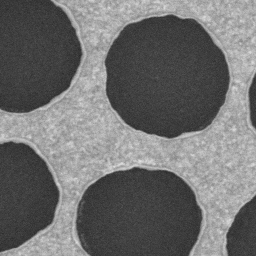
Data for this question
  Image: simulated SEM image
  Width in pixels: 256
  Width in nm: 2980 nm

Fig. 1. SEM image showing holes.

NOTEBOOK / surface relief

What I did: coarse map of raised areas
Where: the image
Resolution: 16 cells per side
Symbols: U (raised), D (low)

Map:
DDDDUUUUUUUUUUUU
DDDDDUUUDDDDDUUU
DDDDDUUDDDDDDUUU
DDDDDUUDDDDDDDUU
DDDDDUUDDDDDDDUU
DDDDUUUDDDDDDDUU
DDDUUUUDDDDDDDUD
UUUUUUUUDDDDDUUU
UUUUUUUUUUDUUUUU
DDUUUUUUUUUUUUUU
DDDUUUUUDUUUUUUU
DDDDUUDDDDDDUUUU
DDDDUDDDDDDDUUUU
DDDUUDDDDDDDDUUD
DDDUUDDDDDDDDUDD
DUUUUDDDDDDDUUDD